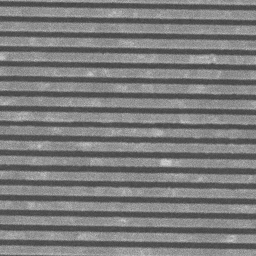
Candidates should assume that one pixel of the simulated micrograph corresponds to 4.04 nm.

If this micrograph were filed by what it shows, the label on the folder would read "parallel lines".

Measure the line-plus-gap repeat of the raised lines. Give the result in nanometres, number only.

60.2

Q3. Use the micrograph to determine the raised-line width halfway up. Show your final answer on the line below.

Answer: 35.4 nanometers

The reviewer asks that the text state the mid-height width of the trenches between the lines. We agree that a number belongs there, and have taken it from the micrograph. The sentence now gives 24.8 nm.